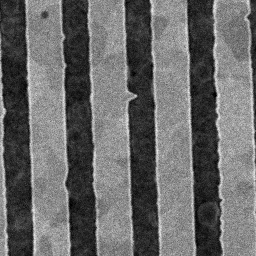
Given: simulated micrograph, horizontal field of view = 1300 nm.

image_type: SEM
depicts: one or a few lines or trenches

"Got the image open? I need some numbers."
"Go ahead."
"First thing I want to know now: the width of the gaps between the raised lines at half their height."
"142 nanometres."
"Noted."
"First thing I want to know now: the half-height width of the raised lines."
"174 nm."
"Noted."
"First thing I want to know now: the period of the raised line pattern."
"318 nanometers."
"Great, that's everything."